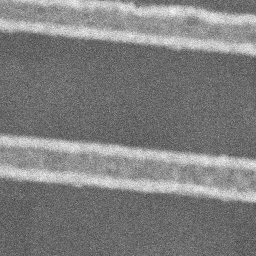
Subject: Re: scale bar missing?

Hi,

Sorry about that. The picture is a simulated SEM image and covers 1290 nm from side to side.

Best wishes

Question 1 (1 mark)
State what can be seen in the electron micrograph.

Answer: one or a few lines or trenches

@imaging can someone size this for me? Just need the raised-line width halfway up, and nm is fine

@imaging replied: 155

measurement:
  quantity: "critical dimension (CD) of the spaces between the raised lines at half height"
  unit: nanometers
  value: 576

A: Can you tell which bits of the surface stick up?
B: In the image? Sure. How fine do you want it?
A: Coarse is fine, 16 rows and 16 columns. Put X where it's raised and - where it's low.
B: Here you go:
XXXXXXXX--------
XXXXXXXXXXXXXXXX
----------XXXXXX
----------------
----------------
----------------
----------------
----------------
----------------
XXXXXXXX--------
XXXXXXXXXXXXXXXX
--------XXXXXXXX
----------------
----------------
----------------
----------------